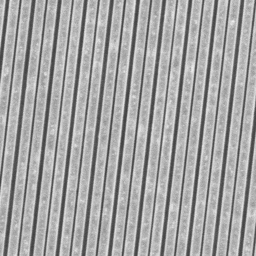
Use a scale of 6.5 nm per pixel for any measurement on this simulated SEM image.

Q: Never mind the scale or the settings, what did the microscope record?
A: parallel lines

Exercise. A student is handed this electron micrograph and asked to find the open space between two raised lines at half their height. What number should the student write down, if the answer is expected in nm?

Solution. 29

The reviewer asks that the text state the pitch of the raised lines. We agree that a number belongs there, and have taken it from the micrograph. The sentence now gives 84.2 nm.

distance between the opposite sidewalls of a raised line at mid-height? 9.18 px